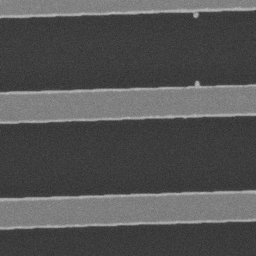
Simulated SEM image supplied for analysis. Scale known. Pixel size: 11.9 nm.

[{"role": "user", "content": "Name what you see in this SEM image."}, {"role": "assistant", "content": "lines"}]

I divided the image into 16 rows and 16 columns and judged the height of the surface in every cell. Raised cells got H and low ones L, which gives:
HHHHHHHHHHHHHHHH
LLLLLLLLLLLLLLLL
LLLLLLLLLLLLLLLL
LLLLLLLLLLLLLLLL
LLLLLLLLLLLLLLLL
LLLLLLLLLHHHHHHH
HHHHHHHHHHHHHHHH
HHHHHHLLLLLLLLLL
LLLLLLLLLLLLLLLL
LLLLLLLLLLLLLLLL
LLLLLLLLLLLLLLLL
LLLLLLLLLLLLLLLL
HHHHHHHHHHHHHHHH
HHHHHHHHHHHHHHHH
LLLLLLLLLLLLLLLL
LLLLLLLLLLLLLLLL